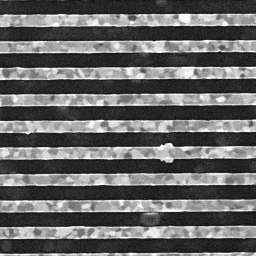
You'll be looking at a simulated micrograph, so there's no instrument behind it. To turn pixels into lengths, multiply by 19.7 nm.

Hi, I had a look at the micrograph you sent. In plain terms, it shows parallel lines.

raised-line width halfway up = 224 nm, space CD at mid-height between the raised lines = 15.3 px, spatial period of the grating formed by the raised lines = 26.5 pixels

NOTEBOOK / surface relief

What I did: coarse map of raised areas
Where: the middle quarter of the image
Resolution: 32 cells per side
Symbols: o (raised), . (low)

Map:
................................
oooooooooooooooooooooooooooooooo
oooooooooooooooooooooooooooooooo
ooooooooooooooooooooooooooo..oo.
................................
................................
................................
................................
oooooooooooooooooooooooooooooooo
oooooooooooooooooooooooooooooooo
o...............................
o...............................
................................
................................
oooooooooooooooooooooooooooooooo
oooooooooooooooooooooooooooooooo
oooooooooooooooooooooooooooooooo
................................
................................
................................
........................ooo.....
oooooooooooooooooooooooooooooooo
oooooooooooooooooooooooooooooooo
oooooooooooooooooooooo.ooooo....
................................
................................
................................
...................o....o.......
oooooooooooooooooooooooooooooooo
oooooooooooooooooooooooooooooooo
................................
................................